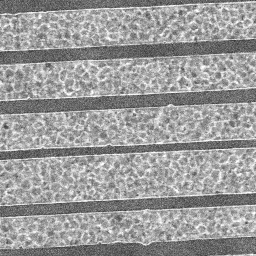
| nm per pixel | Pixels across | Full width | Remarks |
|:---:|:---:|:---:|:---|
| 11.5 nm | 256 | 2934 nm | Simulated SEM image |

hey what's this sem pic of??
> parallel lines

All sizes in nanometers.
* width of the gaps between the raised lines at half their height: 153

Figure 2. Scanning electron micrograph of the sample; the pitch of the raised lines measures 575 nanometers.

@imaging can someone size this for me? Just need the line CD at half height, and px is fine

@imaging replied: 35.6